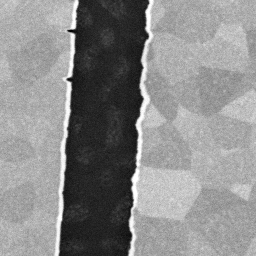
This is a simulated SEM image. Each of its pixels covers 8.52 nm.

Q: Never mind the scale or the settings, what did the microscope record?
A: one or a few lines or trenches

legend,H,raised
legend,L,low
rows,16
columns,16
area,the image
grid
HHHHHLLLLHHHHHHH
HHHHHLLLLHHHHHHH
HHHHHLLLLHHHHHHH
HHHHHLLLLHHHHHHH
HHHHLLLLLHHHHHHH
HHHHLLLLLHHHHHHH
HHHHLLLLLHHHHHHH
HHHHLLLLLHHHHHHH
HHHHLLLLLHHHHHHH
HHHHLLLLLHHHHHHH
HHHHLLLLLHHHHHHH
HHHHLLLLHHHHHHHH
HHHHLLLLHHHHHHHH
HHHHLLLLHHHHHHHH
HHHHLLLLHHHHHHHH
HHHHLLLLHHHHHHHH